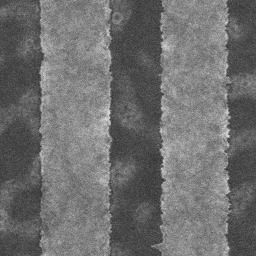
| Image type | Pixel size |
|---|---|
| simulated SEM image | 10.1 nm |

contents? one or a few lines or trenches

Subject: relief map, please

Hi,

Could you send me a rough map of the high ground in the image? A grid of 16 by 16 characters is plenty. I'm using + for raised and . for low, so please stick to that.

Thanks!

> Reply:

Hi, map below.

...++++...++++..
...++++...++++..
...++++...++++..
...++++...++++..
...++++...++++..
...++++...++++..
...++++...++++..
...++++...++++..
...++++...++++..
...++++...++++..
...++++...++++..
...++++...++++..
...++++...++++..
...++++...++++..
...++++...++++..
...++++...++++..